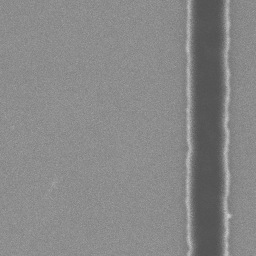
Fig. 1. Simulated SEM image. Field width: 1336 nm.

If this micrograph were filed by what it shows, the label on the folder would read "one or a few lines or trenches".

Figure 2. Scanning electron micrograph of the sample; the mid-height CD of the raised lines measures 40.2 px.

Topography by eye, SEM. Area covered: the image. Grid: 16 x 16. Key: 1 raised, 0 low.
0000000000001100
0000000000001100
0000000000001100
0000000000001100
0000000000001100
0000000000001100
0000000000001100
0000000000001100
0000000000001100
0000000000001100
0000000000001100
0000000000001100
0000000000001100
0000000000001100
0000000000001100
0000000000001100